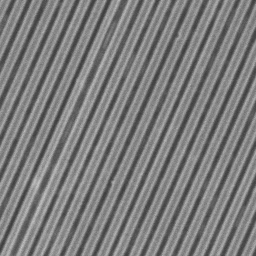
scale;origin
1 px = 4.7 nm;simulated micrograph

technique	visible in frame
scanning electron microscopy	parallel lines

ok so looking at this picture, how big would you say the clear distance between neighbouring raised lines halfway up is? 28 nanometers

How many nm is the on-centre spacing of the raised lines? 69.2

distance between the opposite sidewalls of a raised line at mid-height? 8.49 pixels